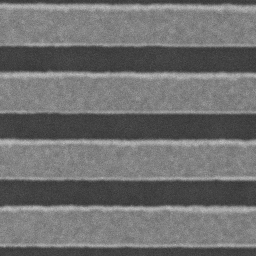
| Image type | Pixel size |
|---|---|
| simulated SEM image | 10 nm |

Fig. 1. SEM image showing lines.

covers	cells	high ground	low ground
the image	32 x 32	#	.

................................
################################
################################
################################
################################
################################
................................
................................
................................
################################
################################
################################
################################
################################
................................
................................
................................
................................
################################
################################
################################
################################
................................
................................
................................
................................
################################
################################
################################
################################
################################
................................